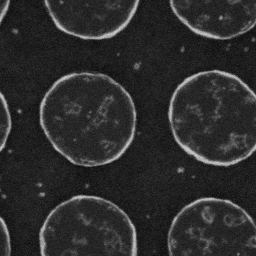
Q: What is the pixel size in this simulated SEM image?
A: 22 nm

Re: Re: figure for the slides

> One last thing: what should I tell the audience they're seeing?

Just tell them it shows raised bodies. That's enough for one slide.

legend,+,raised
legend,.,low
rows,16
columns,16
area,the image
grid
...+++++...+++++
....++++....++++
................
................
................
...+++++...++++.
...+++++...+++++
+..+++++...+++++
...+++++...+++++
....++++....++++
................
................
....++.......+..
...+++++...++++.
...+++++...+++++
+..+++++...+++++